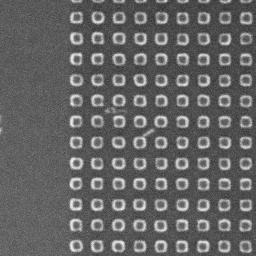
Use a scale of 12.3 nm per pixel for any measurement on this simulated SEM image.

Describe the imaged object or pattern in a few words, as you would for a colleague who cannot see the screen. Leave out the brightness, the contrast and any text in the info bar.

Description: a regular array of raised bodies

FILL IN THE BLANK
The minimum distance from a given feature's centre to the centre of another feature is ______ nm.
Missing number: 253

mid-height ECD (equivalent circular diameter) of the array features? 137 nm